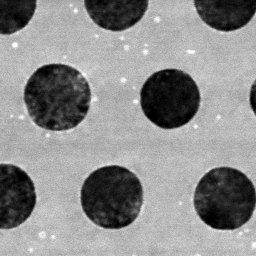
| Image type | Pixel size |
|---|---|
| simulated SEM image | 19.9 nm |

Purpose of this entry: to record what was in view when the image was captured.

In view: holes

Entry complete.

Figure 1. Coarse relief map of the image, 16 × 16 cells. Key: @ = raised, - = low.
--@@@----@@@----
--@@@@--@@@@@--@
@@@@@@@@@@@@@@@@
@@@@@@@@@@@@@@@@
@@---@@@@@--@@@@
@@----@@@---@@@@
@@----@@@---@@@@
@@---@@@@---@@@@
@@@@@@@@@@@@@@@@
@@@@@@@@@@@@@@@@
-@@@@@--@@@@@@-@
--@@@----@@@----
--@@@----@@@----
--@@@----@@@----
@@@@@@@@@@@@@@@@
@@@@@@@@@@@@@@@@